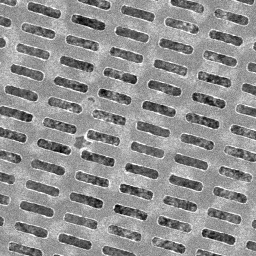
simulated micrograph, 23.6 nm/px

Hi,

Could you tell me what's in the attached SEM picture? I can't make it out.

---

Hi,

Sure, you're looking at a regular array of holes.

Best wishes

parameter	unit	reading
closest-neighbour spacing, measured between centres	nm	507